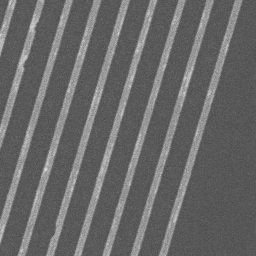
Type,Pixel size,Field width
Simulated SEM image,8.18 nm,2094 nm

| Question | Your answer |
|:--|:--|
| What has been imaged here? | parallel lines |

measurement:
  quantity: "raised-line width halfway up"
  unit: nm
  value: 55.9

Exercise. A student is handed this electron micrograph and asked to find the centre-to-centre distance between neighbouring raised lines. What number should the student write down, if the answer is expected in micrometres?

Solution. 0.221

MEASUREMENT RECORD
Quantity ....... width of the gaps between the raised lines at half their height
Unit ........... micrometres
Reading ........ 0.168